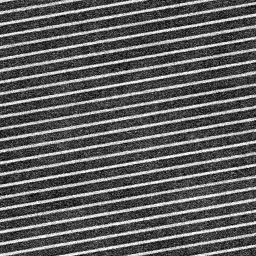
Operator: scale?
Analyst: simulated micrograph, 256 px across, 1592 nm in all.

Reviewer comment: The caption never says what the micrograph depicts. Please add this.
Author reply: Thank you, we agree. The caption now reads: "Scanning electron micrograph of parallel lines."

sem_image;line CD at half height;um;0.0122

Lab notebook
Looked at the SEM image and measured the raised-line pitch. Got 70.8 nanometers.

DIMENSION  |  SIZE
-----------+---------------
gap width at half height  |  61.3 nm